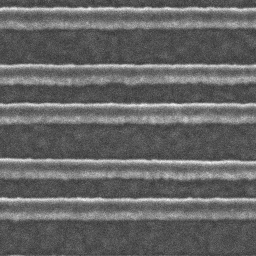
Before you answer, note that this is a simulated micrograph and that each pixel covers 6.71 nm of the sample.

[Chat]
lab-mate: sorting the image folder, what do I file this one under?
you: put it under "lines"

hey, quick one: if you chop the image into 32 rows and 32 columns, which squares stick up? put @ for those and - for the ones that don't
--------------------------------
@@@@@@@@@@@@@@@@@@@@@@@@@@@@@@@@
@@@@@@@@@@@@@@@@@@@@@@@@@@@@@@@@
--------------------------------
--------------------------------
--------------------------------
--------------------------------
--------------------------------
@@@@@@@@@@@@@@@@@@@@@@@@@@@@@@@@
@@@@@@@@@@@@@@@@@@@@@@@@@@@@@@@@
--------------------------------
--------------------------------
--------------------------------
@@@@@@@@@@@@@@@@@@@@@@@@@@@@@@@@
@@@@@@@@@@@@@@@@@@@@@@@@@@@@@@@@
--------------------------------
--------------------------------
--------------------------------
--------------------------------
--------------------------------
@@@@@@@@@@@@@@@@@@@@@@@@@@@@@@@@
@@@@@@@@@@@@@@@@@@@@@@@@@@@@@@@@
--------------------------------
--------------------------------
--------------------------------
@@@@@@@@@@@@@@@@@@@@@@@@@@@@@@@@
@@@@@@@@@@@@@@@@@@@@@@@@@@@@@@@@
--------------------------------
--------------------------------
--------------------------------
--------------------------------
--------------------------------